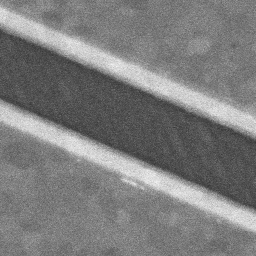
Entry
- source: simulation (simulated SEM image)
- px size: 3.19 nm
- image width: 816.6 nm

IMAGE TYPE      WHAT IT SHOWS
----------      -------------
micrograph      one or a few lines or trenches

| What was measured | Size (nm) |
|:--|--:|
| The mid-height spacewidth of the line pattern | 289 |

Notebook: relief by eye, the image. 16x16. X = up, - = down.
XXXXXXXXXXXXXXXX
-XXXXXXXXXXXXXXX
----XXXXXXXXXXXX
------XXXXXXXXXX
--------XXXXXXXX
-----------XXXXX
-------------XXX
X--------------X
XXX-------------
XXXXXX----------
XXXXXXXX--------
XXXXXXXXXX------
XXXXXXXXXXXXX---
XXXXXXXXXXXXXXX-
XXXXXXXXXXXXXXXX
XXXXXXXXXXXXXXXX